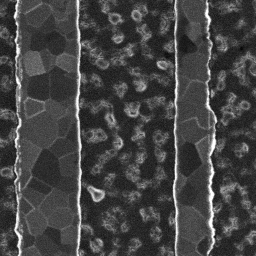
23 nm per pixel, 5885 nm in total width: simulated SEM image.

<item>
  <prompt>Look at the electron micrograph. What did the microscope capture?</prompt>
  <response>one or a few lines or trenches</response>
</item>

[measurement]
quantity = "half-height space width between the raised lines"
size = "2230 nm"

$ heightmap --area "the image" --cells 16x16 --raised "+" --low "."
.++++......++...
.++++......++...
.++++......++...
.++++......++...
.++++......++...
.++++......++...
.++++......++...
.++++......++...
.++++......++...
.++++......++...
.++++......++...
.++++......++...
.++++......++...
.++++......++...
.++++......++...
.++++......++...